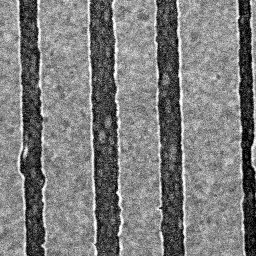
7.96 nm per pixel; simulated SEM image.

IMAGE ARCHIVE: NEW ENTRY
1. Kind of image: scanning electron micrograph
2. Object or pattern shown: one or a few lines or trenches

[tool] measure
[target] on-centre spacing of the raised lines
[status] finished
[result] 575 nm